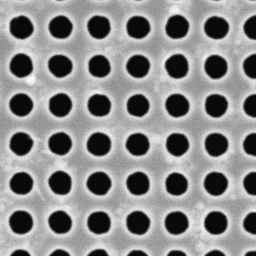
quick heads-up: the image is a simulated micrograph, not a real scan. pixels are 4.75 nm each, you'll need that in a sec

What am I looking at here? a regular array of holes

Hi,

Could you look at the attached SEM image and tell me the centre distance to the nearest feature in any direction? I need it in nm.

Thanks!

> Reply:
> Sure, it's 184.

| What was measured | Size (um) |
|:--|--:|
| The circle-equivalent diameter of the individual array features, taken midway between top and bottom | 0.112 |